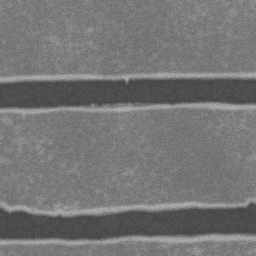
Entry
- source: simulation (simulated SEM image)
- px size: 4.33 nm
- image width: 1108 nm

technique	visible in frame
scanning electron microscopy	one or a few lines or trenches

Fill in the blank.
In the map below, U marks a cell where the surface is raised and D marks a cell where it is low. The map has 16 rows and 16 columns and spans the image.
UUUUUUUUUUUUUUUU
UUUUUUUUUUUUUUUU
UUUUUUUUUUUUUUUU
UUUUUUUUUUUUUUUU
UUUUUUUUUUUUUUUU
DDDDDDDDDDDDDDDD
DDDDDDDDDDDDDDDD
UUUUUUUUUUUUUUUU
UUUUUUUUUUUUUUUU
UUUUUUUUUUUUUUUU
UUUUUUUUUUUUUUUU
UUUUUUUUUUUUUUUU
UUUUUUUUUUUUUUUU
DDDDDDDDDDDDDDDD
DDDDDDDDDDDDDDDD
UUUUUUUUUUUUUUUU